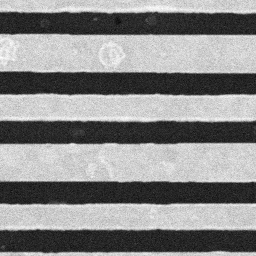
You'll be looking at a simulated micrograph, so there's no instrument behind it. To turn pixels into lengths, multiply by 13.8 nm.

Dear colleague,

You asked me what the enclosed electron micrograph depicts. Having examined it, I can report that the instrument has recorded lines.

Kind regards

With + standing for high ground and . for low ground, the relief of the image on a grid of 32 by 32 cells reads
++++++++++++++++++++++++++++++++
..........................+.++++
................................
................................
++++++++++++++++++++++++++++++++
++++++++++++++++++++++++++++++++
++++++++++++++++++++++++++++++++
++++++++++++++++++++++++++++++++
++++++++++++++++++++++++++++++++
................................
................................
................................
++++++++++++++++++++++++++++++++
++++++++++++++++++++++++++++++++
++++++++++++++++++++++++++++++++
................................
................................
................................
++++++++++++++++++++++++++++++++
++++++++++++++++++++++++++++++++
++++++++++++++++++++++++++++++++
++++++++++++++++++++++++++++++++
++++++++++++++++++++++++++++++++
................................
................................
................................
++++++++++++++++++++++++++++++++
++++++++++++++++++++++++++++++++
+++++++++++++++++++.++++++++++++
................................
................................
................................